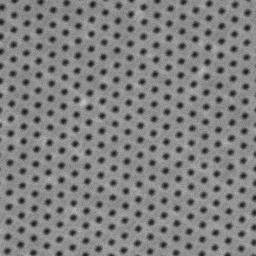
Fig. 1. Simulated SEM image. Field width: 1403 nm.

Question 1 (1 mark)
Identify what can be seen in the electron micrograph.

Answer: a regular array of holes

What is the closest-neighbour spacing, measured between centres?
0.0789 um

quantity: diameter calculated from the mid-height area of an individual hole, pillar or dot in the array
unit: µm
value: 0.0381